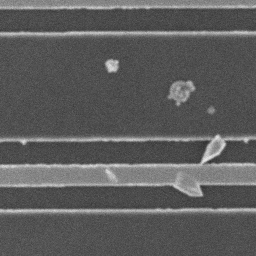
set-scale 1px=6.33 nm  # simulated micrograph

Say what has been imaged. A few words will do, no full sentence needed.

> lines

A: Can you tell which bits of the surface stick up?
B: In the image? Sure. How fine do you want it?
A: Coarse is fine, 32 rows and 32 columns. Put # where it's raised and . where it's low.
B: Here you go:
################################
................................
................................
................................
################################
################################
################################
################################
################################
################################
################################
################################
################################
################################
################################
################################
################################
###################..###..###...
..........................##....
.........................##.....
.........................#....#.
################################
################################
......................###.......
................................
................................
################################
################################
################################
################################
################################
################################